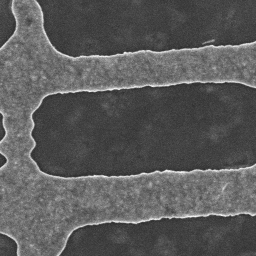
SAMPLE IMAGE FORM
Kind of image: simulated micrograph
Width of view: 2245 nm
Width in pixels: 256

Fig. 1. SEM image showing one or a few lines or trenches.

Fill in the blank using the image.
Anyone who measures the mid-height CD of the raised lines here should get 352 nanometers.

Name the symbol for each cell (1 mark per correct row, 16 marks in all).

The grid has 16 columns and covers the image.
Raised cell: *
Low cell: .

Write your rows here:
.**.............
.**.............
.**.............
****...*********
****************
********........
**..............
**..............
**..............
**..............
**.............*
****************
****************
*************...
*****...........
.***............